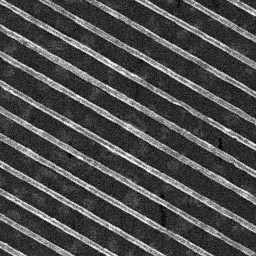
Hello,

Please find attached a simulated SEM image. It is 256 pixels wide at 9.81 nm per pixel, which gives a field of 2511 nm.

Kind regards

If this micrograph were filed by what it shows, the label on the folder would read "parallel lines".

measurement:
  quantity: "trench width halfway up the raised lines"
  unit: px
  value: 18.2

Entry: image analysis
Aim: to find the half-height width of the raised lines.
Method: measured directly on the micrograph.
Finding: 44.6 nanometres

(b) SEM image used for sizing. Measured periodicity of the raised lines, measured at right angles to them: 230 nanometres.